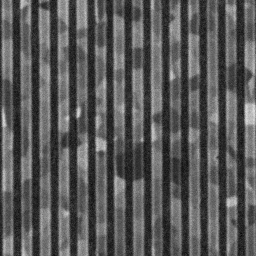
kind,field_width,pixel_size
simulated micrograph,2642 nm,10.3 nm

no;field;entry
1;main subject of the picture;parallel lines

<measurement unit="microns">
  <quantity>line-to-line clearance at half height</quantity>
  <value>0.102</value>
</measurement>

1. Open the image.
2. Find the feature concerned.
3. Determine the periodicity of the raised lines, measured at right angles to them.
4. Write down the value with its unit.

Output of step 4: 0.193 µm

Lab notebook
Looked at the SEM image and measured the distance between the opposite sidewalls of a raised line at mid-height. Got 91.6 nm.